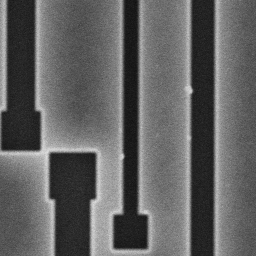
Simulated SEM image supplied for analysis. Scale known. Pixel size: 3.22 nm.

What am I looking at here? groups of lines, slits or small figures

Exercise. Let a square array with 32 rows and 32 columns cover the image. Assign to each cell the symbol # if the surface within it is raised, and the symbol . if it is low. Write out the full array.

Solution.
#....##########..#######...#####
#....##########..#######...#####
#....##########..#######...#####
#....##########..#######...#####
#....##########..#######...#####
#....##########..#######...#####
#....##########..#######...#####
#....##########..#######...#####
#....##########..#######...#####
#....##########..#######...#####
#....##########..#######...#####
#....##########..#######...#####
#....##########..#######...#####
#....##########..#######...#####
.....##########..#######...#####
.....##########..#######...#####
.....##########..#######...#####
.....##########..#######...#####
.....##########..#######...#####
######......###..#######...#####
######......###..#######...#####
######......###..#######...#####
######......###..#######...#####
######......###..#######...#####
######......###..#######...#####
#######....####..#######...#####
#######....####...######...#####
#######....###.....#####...#####
#######....###.....#####...#####
#######....###.....#####...#####
#######....###.....#####...#####
#######....#############...#####